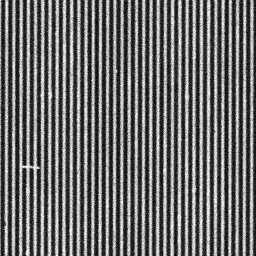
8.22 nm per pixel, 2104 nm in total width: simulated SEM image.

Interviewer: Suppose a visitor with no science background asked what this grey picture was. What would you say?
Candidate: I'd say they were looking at parallel lines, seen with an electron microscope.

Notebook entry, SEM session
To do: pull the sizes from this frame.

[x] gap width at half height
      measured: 37 nanometres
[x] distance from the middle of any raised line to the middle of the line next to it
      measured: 0.0593 µm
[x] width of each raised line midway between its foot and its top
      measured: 22.6 nm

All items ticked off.